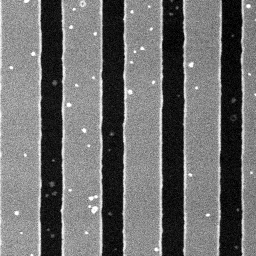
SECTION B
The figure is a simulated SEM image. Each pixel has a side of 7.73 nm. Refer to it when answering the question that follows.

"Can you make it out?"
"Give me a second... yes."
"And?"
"lines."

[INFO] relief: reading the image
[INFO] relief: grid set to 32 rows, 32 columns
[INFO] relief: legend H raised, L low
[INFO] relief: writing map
HHHHHLLLHHHHHLLLHHHHLLLHHHHHLLHH
HHHHHLLLHHHHHLLLHHHHLLLHHHHHLLHH
HHHHHLLLHHHHHLLHHHHHLLLHHHHHLLHH
HHHHHLLLHHHHHLLLHHHHLLLHHHHHLLHH
HHHHHLLLHHHHHLLHHHHHLLLHHHHHLLHH
HHHHHLLLHHHHHLLLHHHHLLLHHHHHLLHH
HHHHHLLLHHHHHLLLHHHHLLLHHHHHLLHH
HHHHHLLLHHHHHLLLHHHHLLLHHHHHLLHH
HHHHHLLLHHHHHLLLHHHHLLLHHHHHLLHH
HHHHHLLLHHHHHLLHHHHHLLLHHHHHLLHH
HHHHHLLLHHHHHLLLHHHHLLLHHHHHLLHH
HHHHHLLLHHHHHLLLHHHHLLLHHHHHLLHH
HHHHHLLLHHHHHLLLHHHHLLLHHHHHLLHH
HHHHHLLLHHHHHLLLHHHHLLLHHHHHLLHH
HHHHHLLLHHHHHLLLHHHHLLLHHHHHLLHH
HHHHHLLLHHHHHLLHHHHHLLLHHHHHLLHH
HHHHHLLLHHHHHLLHHHHHLLLHHHHHLLHH
HHHHHLLLHHHHHLLHHHHHLLLHHHHHLLHH
HHHHHLLLHHHHHLLHHHHHLLLHHHHHLLHH
HHHHHLLLHHHHHLLHHHHHLLLHHHHHLLHH
HHHHHLLLHHHHHLLHHHHHLLLHHHHHLLHH
HHHHHLLLHHHHHLLHHHHHLLLHHHHHLLHH
HHHHHLLLHHHHHLLHHHHHLLLHHHHHLLHH
HHHHHLLLHHHHHLLHHHHHLLLHHHHHLLHH
HHHHHLLLHHHHHLLHHHHHLLLHHHHHLLHH
HHHHHLLLHHHHHLLHHHHHLLLHHHHHLLHH
HHHHHLLLHHHHHLLHHHHHLLLHHHHHLLHH
HHHHHLLLHHHHHLLHHHHHLLLHHHHHLLHH
HHHHHLLLHHHHHLLHHHHHLLLHHHHLLLHH
HHHHHLLLHHHHHLLHHHHHLLLHHHHLLLHH
HHHHHLLLHHHHHLLHHHHHLLLHHHHLLLHH
HHHHHLLLHHHHHLLHHHHHLLLHHHHLLLHH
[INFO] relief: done